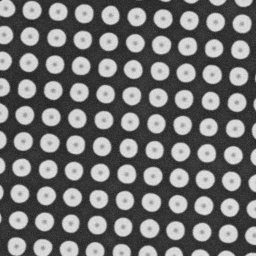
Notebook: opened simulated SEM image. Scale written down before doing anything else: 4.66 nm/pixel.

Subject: an array of small figures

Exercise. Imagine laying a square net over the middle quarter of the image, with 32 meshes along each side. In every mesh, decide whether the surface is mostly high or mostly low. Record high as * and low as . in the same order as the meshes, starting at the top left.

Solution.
..****...****..****...****...***
..****...****..****...****..****
...**....****...***...****..****
.................*.....**....***
................................
..***....**.....................
..****...***...****...***.......
..****..*****..****..*****..****
..****..****...****..*****..****
.........***...****...****..****
.......................*....****
...*............................
.****...****....*...............
.****...****...***...****...***.
.****...****..*****..****...****
..***...****..****...****...****
................*.....***...****
.............................*..
.****....*......................
.****...***....***....**........
.****..*****..****...****..****.
.****..*****..****...****..****.
........***...****...****..****.
......................**...****.
................................
.***....**.....**...............
*****..****...****..****....**..
*****..****...****..****...****.
.***...****...****..****...****.
...............**...****...****.
............................**..
.**.............................